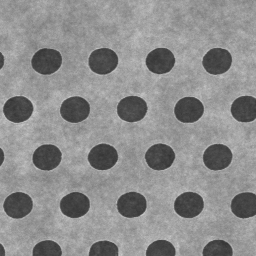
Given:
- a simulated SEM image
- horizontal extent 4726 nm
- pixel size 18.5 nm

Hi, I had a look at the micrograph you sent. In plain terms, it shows a regular array of holes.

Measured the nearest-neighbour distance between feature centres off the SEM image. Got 1.02 micrometres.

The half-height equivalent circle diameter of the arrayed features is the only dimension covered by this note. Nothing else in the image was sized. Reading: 0.524 µm